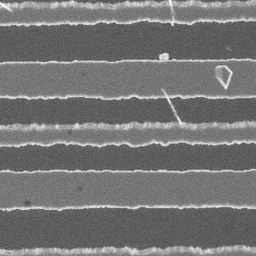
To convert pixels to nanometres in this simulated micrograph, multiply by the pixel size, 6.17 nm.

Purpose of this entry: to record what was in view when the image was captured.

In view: lines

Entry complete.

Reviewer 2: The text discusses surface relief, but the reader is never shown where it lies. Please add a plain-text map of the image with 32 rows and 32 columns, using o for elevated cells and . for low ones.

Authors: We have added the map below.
........o.........o.oo.oo...oooo
oooooooooooooooooooooooooooooooo
oooooooooooooooooooooooooooooooo
................................
................................
................................
................................
....................oo.....ooooo
oooooooooooooooooooooooooooooooo
oooooooooooooooooooooooooooooooo
oooooooooooooooooooooooooooooooo
oooooooooooooooooooooooooooooooo
................................
................................
................................
......................o.........
oooooooooooooooooooooooooooooooo
oooooooooooooooooooooooooooooooo
................................
................................
................................
oo.ooooooooooooooooooooooooooooo
oooooooooooooooooooooooooooooooo
oooooooooooooooooooooooooooooooo
oooooooooooooooooooooooooooooooo
oooooooooooooooooooooooooooooooo
................................
................................
................................
................................
................................
....oooo.oooooooo.oooooooooooooo